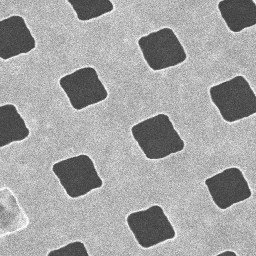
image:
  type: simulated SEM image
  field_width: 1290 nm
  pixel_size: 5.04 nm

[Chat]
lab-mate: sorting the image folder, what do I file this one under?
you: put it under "holes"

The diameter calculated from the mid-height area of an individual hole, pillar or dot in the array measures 41.7 px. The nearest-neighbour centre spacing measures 440 nm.